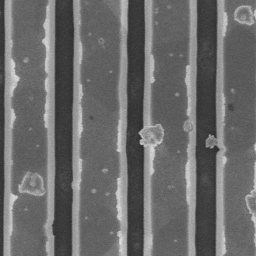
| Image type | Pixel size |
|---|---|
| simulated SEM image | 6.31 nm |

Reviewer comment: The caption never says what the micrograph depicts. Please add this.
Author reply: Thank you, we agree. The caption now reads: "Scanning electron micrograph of one or a few lines or trenches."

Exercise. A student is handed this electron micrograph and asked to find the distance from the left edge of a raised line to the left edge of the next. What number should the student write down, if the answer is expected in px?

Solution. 70.2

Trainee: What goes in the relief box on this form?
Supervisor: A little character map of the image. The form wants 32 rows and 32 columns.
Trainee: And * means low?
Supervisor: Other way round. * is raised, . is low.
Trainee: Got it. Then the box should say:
.*****....******...*****....****
.*****....*****....*****....****
.*****....*****....*****....****
.*****....*****....*****....****
.*****....*****....*****....****
.*****....*****....*****....****
.*****....*****....*****....****
.*****....*****....*****....****
.*****....*****....*****....****
.*****....*****....*****....****
.*****....*****....*****....****
.*****....*****....*****....****
.*****....*****...******....****
.*****....*****...******....****
.*****....*****...******....****
.*****....*****...******....****
.*****....*****...******....****
.*****....*****...******....****
.*****....*****...******....****
.*****....*****....*****....****
.*****....*****....*****....****
.*****....*****....*****....****
.*****....*****....*****....****
.*****....*****...******....****
.*****....*****...******....****
.*****...******...******....****
.*****...******....*****....****
.*****...******...******....****
.*****...******...******....****
.*****...******...******....****
.*****...******...******....****
.*****...******...******....****